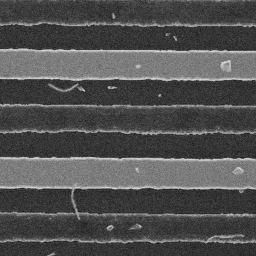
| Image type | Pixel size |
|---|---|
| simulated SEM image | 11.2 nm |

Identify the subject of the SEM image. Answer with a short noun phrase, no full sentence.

lines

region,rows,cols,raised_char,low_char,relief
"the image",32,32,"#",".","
################################
################################
################################
................................
................................
................................
################################
################################
################################
################################
................................
................................
................................
################################
################################
################################
###........#...#################
................................
................................
................................
################################
################################
################################
.........#....#....#...#....####
................................
................................
................................
################################
################################
################################
................................
................................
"